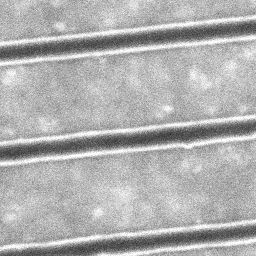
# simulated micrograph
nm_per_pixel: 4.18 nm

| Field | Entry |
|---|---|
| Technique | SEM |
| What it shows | one or a few lines or trenches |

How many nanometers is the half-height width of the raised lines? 89.5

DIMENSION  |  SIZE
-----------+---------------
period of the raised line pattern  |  419 nanometres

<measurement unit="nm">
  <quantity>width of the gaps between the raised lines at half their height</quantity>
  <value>331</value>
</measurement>